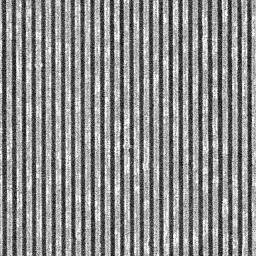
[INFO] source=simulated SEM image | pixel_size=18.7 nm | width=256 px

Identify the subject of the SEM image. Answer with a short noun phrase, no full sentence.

parallel lines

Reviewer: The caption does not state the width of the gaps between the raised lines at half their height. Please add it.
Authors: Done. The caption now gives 0.084 µm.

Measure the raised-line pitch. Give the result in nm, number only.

183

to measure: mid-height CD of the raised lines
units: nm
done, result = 98